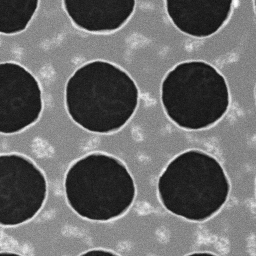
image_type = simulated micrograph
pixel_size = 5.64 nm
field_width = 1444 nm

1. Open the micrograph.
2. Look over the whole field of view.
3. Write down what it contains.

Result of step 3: holes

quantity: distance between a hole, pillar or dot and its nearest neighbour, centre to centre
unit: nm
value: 511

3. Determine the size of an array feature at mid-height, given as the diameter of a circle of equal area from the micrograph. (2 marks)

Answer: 384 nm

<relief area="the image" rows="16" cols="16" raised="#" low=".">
..##....##....##
..###...###...##
################
################
..###...###...##
..##.....#....##
...#.....#....##
..###...###...##
################
############.###
..###...##....##
...#....##....##
...#....##....##
..###..####..###
################
################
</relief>